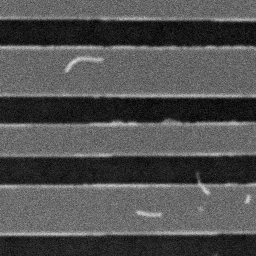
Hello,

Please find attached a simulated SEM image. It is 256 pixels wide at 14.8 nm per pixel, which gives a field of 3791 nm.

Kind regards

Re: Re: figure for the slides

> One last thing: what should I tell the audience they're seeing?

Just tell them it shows lines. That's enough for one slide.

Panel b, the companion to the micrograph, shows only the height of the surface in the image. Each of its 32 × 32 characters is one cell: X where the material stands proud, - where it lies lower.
XXXXXXXXXXXXXXXXXXXXXXXXXXXXXXXX
XXXXXXXXXXXXXXXXXXXXXXXXXXXXXXXX
---------------------------XXXXX
--------------------------------
--------------------------------
--------------------------------
XXXXXXXXXXXXXXXXXXXXXXXXXXXXXXXX
XXXXXXXXXXXXXXXXXXXXXXXXXXXXXXXX
XXXXXXXXXXXXXXXXXXXXXXXXXXXXXXXX
XXXXXXXXXXXXXXXXXXXXXXXXXXXXXXXX
XXXXXXXXXXXXXXXXXXXXXXXXXXXXXXXX
XXXXXXXXXXXXXXXXXXXXXXXXXXXXXXXX
--------------------------------
--------------------------------
--------------------------------
-----------XXXXXXXXXXXXXXXXXXXXX
XXXXXXXXXXXXXXXXXXXXXXXXXXXXXXXX
XXXXXXXXXXXXXXXXXXXXXXXXXXXXXXXX
XXXXXXXXXXXXXXXXXXXXXXXXXXXXXXXX
--------------------------------
--------------------------------
--------------------------------
--------------------------------
XXXXXXXXXXXXXXXXXXXXXXXXXXXXXXXX
XXXXXXXXXXXXXXXXXXXXXXXXXXXXXXXX
XXXXXXXXXXXXXXXXXXXXXXXXXXXXXXXX
XXXXXXXXXXXXXXXXXXXXXXXXXXXXXXXX
XXXXXXXXXXXXXXXXXXXXXXXXXXXXXXXX
XXXXXXXXXXXXXXXXXXXXXXXXXXXXXXXX
--------------------------------
--------------------------------
--------------------------------